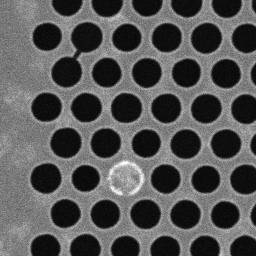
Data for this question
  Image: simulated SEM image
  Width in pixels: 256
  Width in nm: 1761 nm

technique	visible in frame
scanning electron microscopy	a regular array of holes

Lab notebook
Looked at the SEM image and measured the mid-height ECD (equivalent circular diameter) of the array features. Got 0.205 µm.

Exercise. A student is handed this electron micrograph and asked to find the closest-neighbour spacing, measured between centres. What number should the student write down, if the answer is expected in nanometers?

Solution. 274